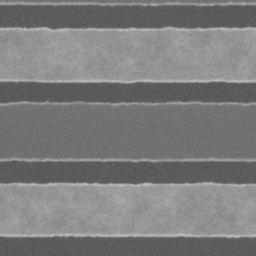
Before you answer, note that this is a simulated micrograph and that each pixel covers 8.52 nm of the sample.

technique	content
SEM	lines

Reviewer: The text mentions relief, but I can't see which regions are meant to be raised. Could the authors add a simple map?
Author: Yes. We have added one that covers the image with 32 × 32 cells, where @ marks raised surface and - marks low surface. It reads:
@@@@@@@@@@@@@@@@@@@@@@@@@@@@@@@@
--------------------------------
--------------------------------
---------------------@----------
@@@@@@@@@@@@@@@@@@@@@@@@@@@@@@@@
@@@@@@@@@@@@@@@@@@@@@@@@@@@@@@@@
@@@@@@@@@@@@@@@@@@@@@@@@@@@@@@@@
@@@@@@@@@@@@@@@@@@@@@@@@@@@@@@@@
@@@@@@@@@@@@@@@@@@@@@@@@@@@@@@@@
@@@@@@@@@@@@@@@@@@@@@@@@@@@@@@@@
--------------------------------
--------------------------------
--------------------------------
@@@@@@@@@@@@@@@@@@@@@@@@@@@@@@@@
@@@@@@@@@@@@@@@@@@@@@@@@@@@@@@@@
@@@@@@@@@@@@@@@@@@@@@@@@@@@@@@@@
@@@@@@@@@@@@@@@@@@@@@@@@@@@@@@@@
@@@@@@@@@@@@@@@@@@@@@@@@@@@@@@@@
@@@@@@@@@@@@@@@@@@@@@@@@@@@@@@@@
@@@@@@@@@@@@@@@@@@@@@@@@@@@@@@@@
--------------------------------
--------------------------------
--------------------------------
@@@@@@@@@@@@@@@@@@@@@@@@@@@@@@@@
@@@@@@@@@@@@@@@@@@@@@@@@@@@@@@@@
@@@@@@@@@@@@@@@@@@@@@@@@@@@@@@@@
@@@@@@@@@@@@@@@@@@@@@@@@@@@@@@@@
@@@@@@@@@@@@@@@@@@@@@@@@@@@@@@@@
@@@@@@@@@@@@@@@@@@@@@@@@@@@@@@@@
@@@@@@@@@@@@@@@@@@@@@@@@@@@@@@@@
--------------------------------
--------------------------------